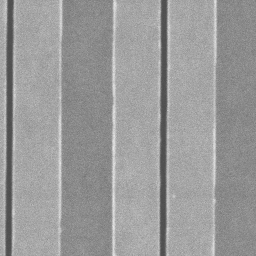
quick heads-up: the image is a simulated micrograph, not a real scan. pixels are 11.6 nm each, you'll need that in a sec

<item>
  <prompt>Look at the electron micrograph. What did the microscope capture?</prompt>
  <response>lines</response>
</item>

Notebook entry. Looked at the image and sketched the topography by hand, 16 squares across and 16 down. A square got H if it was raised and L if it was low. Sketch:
HHHHLLLHHHHHHLLL
HHHHLLLHHHHHHLLL
HHHHLLLHHHHHHLLL
HHHHLLLHHHHHHLLL
HHHHLLLHHHHHHLLL
HHHHLLLHHHHHHLLL
HHHHLLLHHHHHHLLL
HHHHLLLHHHHHHLLL
HHHHLLLHHHHHHLLL
HHHHLLLHHHHHHLLL
HHHHLLLHHHHHHLLL
HHHHLLLHHHHHHLLL
HHHHLLLHHHHHHLLL
HHHHLLLHHHHHHLLL
HHHHLLLHHHHHHLLL
HHHHLLLHHHHHHLLL